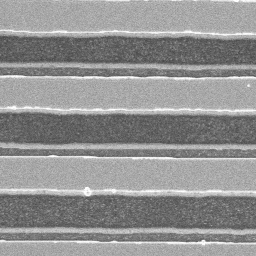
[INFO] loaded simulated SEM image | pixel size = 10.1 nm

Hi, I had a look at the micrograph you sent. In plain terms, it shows lines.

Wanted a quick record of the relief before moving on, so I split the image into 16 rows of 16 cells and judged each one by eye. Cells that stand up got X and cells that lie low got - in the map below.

XXXXXXXXXXXXXXXX
XXXXXXXXXXXXXXXX
----------------
----------------
----------------
XXXXXXXXXXXXXXXX
XXXXXXXXXXXXXXXX
----------------
----------------
----------------
XXXXXXXXXXXXXXXX
XXXXXXXXXXXXXXXX
----------------
----------------
----------------
XXXXXXXXXXXXXXXX